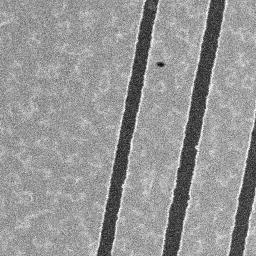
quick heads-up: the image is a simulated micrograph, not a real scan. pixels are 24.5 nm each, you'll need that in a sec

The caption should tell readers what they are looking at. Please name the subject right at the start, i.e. one or a few lines or trenches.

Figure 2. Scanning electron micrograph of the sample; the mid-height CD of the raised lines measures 379 nanometres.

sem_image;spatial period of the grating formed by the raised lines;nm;1610